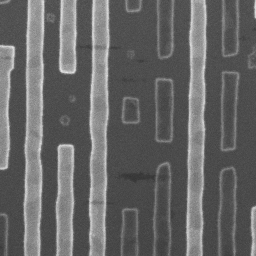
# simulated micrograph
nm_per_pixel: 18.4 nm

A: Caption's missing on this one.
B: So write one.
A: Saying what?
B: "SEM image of wiring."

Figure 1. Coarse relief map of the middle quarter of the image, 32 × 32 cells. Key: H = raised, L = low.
HHHLLLLHHHHLLLLLLLLLLLLLLLLLLLLL
HHHLLLLHHHHLLLLLLLLLLLLLLLLLLLLL
LLLLLLLHHHHLLLLLLLLLLLLLLLLLLLLL
LLLLLLLHHHHLLLLLLLLLLLLLLLLLLLLL
LLLLLLLHHHHLLLLLLLLLLLLHHHHLLLLL
LLLLLLLHHHHLLLLLLLLLLLLHHHHLLLLL
LLLLLLLHHHHLLLLLLLLLLLLHHHHLLLLL
LLLLLLLHHHHLLLLLLLLLLLLHHHHLLLLL
LLLLLLLHHHHLLLLLLLLLLLLHHHHLLLLL
LLLLLLLHHHHLLLLHHHLLLLLHHHHLLLLL
LLLLLLLHHHHLLLLHHHHLLLLHHHHLLLLL
LLLLLLLHHHHLLLLHHHHLLLLHHHHLLLLL
LLLLLLLHHHHLLLLHHHHLLLLHHHHLLLLL
LLLLLLLHHHHLLLLHHHHLLLLHHHHLLLLL
LLLLLLLHHHHLLLLHHHLLLLLHHHHLLLLH
LLLLLLLHHHLLLLLLLLLLLLLHHHHLLLLH
LLLLLLLHHHLLLLLLLLLLLLLHHHHLLLLH
LLLLLLLHHHLLLLLLLLLLLLLHHHHLLLLH
LLLLLLLHHHLLLLLLLLLLLLLHHHHLLLLH
LLLLLLLHHHLLLLLLLLLLLLLLLLLLLLLH
HHLLLLLHHHLLLLLLLLLLLLLLLLLLLLLH
HHLLLLLHHHLLLLLLLLLLLLLLLLLLLLLH
HHLLLLLHHHLLLLLLLLLLLLLLLLLLLLLH
HHLLLLLHHHLLLLLLLLLLLLLLLLLLLLLH
HHLLLLLHHHLLLLLLLLLLLLLLLLLLLLLH
HHLLLLLHHHLLLLLLLLLLLLLLHHLLLLLH
HHLLLLLHHHLLLLLLLLLLLLLHHHLLLLLH
HHLLLLLHHHLLLLLLLLLLLLLHHHLLLLLH
HHLLLLLHHHLLLLLLLLLLLLLHHHLLLLLH
HHLLLLLHHHLLLLLLLLLLLLLHHHLLLLLH
HHLLLLLHHHLLLLLLLLLLLLLHHHLLLLLH
HHLLLLLHHHLLLLLLLLLLLLLHHHLLLLLH